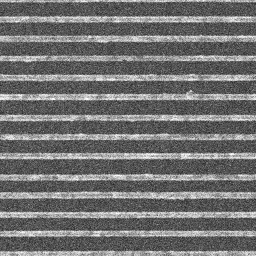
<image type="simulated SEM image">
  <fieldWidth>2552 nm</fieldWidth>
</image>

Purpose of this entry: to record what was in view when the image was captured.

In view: parallel lines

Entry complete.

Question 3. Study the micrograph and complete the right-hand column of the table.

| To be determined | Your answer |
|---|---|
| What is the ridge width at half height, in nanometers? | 49.8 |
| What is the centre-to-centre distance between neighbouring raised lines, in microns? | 0.194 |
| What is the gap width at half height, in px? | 14.3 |